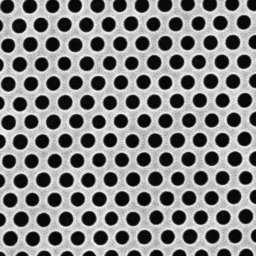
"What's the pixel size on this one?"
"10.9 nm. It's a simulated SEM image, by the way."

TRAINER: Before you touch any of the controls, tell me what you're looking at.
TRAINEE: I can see a regular array of holes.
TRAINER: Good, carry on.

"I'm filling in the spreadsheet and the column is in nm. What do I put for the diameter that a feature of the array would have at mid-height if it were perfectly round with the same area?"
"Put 158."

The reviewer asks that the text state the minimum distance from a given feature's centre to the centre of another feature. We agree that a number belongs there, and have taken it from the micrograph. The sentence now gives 0.237 microns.